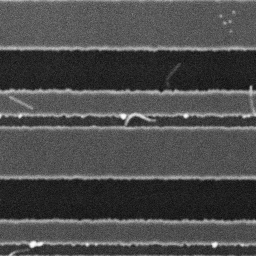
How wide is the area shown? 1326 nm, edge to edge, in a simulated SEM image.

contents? lines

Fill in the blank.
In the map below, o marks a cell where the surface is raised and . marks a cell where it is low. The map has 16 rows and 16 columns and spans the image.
oooooooooooooooo
oooooooooooooooo
oooooooooooooooo
................
................
................
oooooooooooooooo
oooooooooooooooo
oooooooooooooooo
oooooooooooooooo
oooooooooooooooo
................
................
................
oooooooooooooooo
oooooooooooooooo